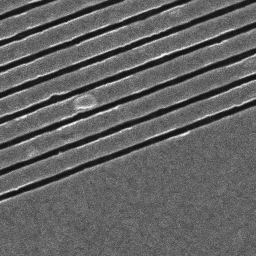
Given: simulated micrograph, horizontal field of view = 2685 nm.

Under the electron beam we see parallel lines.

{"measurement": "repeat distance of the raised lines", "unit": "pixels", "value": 24.1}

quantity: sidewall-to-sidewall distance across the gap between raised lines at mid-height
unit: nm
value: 59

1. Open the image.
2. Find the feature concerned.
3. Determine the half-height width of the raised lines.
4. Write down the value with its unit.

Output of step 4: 196 nanometres